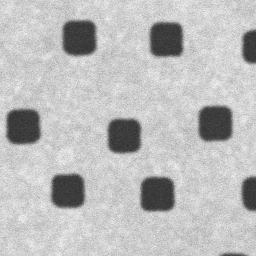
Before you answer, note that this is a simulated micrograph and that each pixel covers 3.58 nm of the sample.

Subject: holes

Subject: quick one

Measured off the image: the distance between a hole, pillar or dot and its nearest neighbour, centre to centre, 280 nm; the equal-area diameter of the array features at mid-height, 133 nanometers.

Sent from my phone